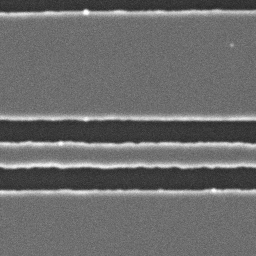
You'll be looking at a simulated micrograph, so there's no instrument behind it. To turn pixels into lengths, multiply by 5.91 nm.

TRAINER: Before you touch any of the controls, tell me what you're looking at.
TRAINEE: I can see lines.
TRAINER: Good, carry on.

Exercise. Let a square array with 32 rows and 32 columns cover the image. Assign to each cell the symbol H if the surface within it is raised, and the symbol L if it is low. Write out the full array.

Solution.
LLLLLLLLLLLLLLLLLLLLLLLLLLLLLLLL
LLLLLLLLLLHLLLHHLLHHHLHHHHHHHHHH
HHHHHHHHHHHHHHHHHHHHHHHHHHHHHHHH
HHHHHHHHHHHHHHHHHHHHHHHHHHHHHHHH
HHHHHHHHHHHHHHHHHHHHHHHHHHHHHHHH
HHHHHHHHHHHHHHHHHHHHHHHHHHHHHHHH
HHHHHHHHHHHHHHHHHHHHHHHHHHHHHHHH
HHHHHHHHHHHHHHHHHHHHHHHHHHHHHHHH
HHHHHHHHHHHHHHHHHHHHHHHHHHHHHHHH
HHHHHHHHHHHHHHHHHHHHHHHHHHHHHHHH
HHHHHHHHHHHHHHHHHHHHHHHHHHHHHHHH
HHHHHHHHHHHHHHHHHHHHHHHHHHHHHHHH
HHHHHHHHHHHHHHHHHHHHHHHHHHHHHHHH
HHHHHHHHHHHHHHHHHHHHHHHHHHHHHHHH
HHHHHHHHHHHHHHHHHHHHHHHHHHHHHHHH
LLLLLLLLLLLLLLLLLLLLLLLLLLLLLLLL
LLLLLLLLLLLLLLLLLLLLLLLLLLLLLLLL
LLLLLLLLLLLLLLLLLLLLLLLLLLLLLLLL
HHHHHHHHHHHHHHHHHHHHHHHHHHHHHHHH
HHHHHHHHHHHHHHHHHHHHHHHHHHHHHHHH
HHHHHHHHHHHHHHHHHHHHHHHHHHHHHHHH
LLLLLLLLLLLLLLLLLLLLLLLLLLLLLLLL
LLLLLLLLLLLLLLLLLLLLLLLLLLLLLLLL
LLLLLLLLLLLLLLLLLLLLLLLLLLLLLLLL
HHHHHHHHHHHHHHHHHHHHHHHHHHHHHHHH
HHHHHHHHHHHHHHHHHHHHHHHHHHHHHHHH
HHHHHHHHHHHHHHHHHHHHHHHHHHHHHHHH
HHHHHHHHHHHHHHHHHHHHHHHHHHHHHHHH
HHHHHHHHHHHHHHHHHHHHHHHHHHHHHHHH
HHHHHHHHHHHHHHHHHHHHHHHHHHHHHHHH
HHHHHHHHHHHHHHHHHHHHHHHHHHHHHHHH
HHHHHHHHHHHHHHHHHHHHHHHHHHHHHHHH